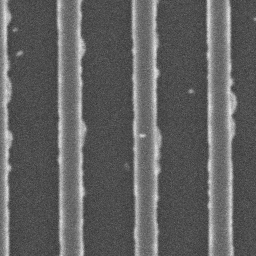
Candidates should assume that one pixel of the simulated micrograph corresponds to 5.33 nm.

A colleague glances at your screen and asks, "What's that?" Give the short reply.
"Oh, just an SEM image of lines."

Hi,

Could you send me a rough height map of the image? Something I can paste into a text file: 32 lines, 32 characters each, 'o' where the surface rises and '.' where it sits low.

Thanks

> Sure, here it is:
o......ooo.......oo.......ooo...
o......ooo.......oo.......ooo...
o......ooo.......oo.......ooo...
o......ooo.......oo.......ooo...
o......ooo.......oo.......ooo...
o......ooo.......oo.......ooo...
o......ooo.......oo.......ooo...
o......ooo.......oo.......ooo...
o......ooo.......oo.......ooo...
o......ooo.......oo.......ooo...
o......ooo.......oo.......ooo...
o......ooo.......oo.......ooo...
o......ooo.......oo.......ooo...
o......ooo.......oo.......ooo...
o......ooo.......oo.......ooo...
o......ooo.......oo.......ooo...
o......ooo.......oo.......ooo...
o......ooo.......oo.......ooo...
o......ooo.......ooo......ooo...
o......ooo.......ooo......ooo...
o......ooo.......oo.......ooo...
o.......oo.......ooo......ooo...
o.......oo.......ooo......ooo...
o.......oo.......ooo......ooo...
o.......oo.......ooo......ooo...
o.......oo.......ooo......ooo...
o.......oo.......oo.......ooo...
o.......oo.......oo.......ooo...
o.......oo.......ooo......ooo...
o.......oo.......ooo......ooo...
o.......oo.......ooo......ooo...
o.......oo.......ooo......ooo...